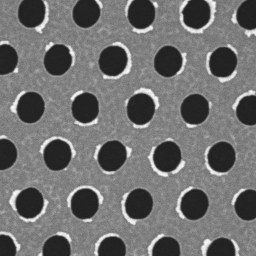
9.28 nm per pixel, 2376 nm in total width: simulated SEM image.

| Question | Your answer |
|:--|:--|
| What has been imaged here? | a regular array of holes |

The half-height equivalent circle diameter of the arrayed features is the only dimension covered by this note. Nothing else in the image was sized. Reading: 279 nanometres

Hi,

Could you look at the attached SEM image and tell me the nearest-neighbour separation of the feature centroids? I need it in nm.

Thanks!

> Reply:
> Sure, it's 507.